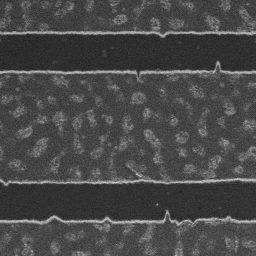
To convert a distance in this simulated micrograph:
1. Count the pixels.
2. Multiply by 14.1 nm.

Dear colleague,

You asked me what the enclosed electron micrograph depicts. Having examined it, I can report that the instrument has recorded one or a few lines or trenches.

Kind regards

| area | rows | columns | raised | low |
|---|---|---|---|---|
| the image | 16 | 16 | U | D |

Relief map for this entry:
UUUUUUUUUUUUUUUU
UUUUUUUUUUUUUUUU
DDDDDDDDDDDDDDDD
DDDDDDDDDDDDDDDD
UUUDDDUDDDDUUUDU
UUUUUUUUUUUUUUUU
UUUUUUUUUUUUUUUU
UUUUUUUUUUUUUUUU
UUUUUUUUUUUUUUUU
UUUUUUUUUUUUUUUU
UUUUUUUUUUUUUUUU
DDDDDDDDDDDDDDDD
DDDDDDDDDDDDDDDD
DDDDDDDDDDDDDDDD
UUUUUUUUUUUUUUUU
UUUUUUUUUUUUUUUU